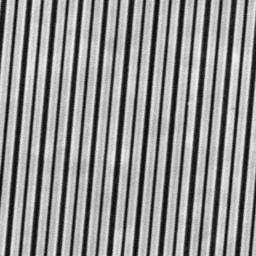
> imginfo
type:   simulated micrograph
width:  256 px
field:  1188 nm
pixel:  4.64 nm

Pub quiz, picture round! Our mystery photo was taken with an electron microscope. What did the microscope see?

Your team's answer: parallel lines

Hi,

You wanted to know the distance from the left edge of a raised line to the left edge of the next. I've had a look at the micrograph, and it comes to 0.0591 micrometres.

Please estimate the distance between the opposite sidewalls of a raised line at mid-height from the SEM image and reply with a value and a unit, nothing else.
35.8 nanometres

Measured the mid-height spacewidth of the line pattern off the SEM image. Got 0.0196 microns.